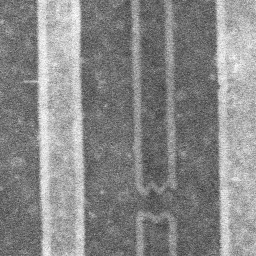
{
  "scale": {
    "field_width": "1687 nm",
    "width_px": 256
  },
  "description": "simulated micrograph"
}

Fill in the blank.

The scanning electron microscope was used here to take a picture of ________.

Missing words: one or a few lines or trenches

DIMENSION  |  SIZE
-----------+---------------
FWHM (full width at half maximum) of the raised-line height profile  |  33.1 px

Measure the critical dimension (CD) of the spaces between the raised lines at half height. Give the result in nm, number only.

389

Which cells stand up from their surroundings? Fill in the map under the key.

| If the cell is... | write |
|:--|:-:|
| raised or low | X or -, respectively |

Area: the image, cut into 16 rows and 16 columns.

---XX---XXX---XX
---XX---XXX---XX
---XX----XX---XX
---XX----XX---XX
---XX----XX---XX
---XX----XX---XX
---XX----XX---XX
---XX----XX---XX
---XX----XX---XX
---XX----XX---XX
---XX----XX---XX
---XX----X----XX
---XX---------XX
---XX---------XX
---XX----XX---XX
---XX----XX---XX